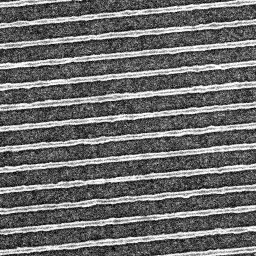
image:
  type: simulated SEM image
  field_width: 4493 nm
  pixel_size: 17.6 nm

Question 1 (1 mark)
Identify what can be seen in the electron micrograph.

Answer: parallel lines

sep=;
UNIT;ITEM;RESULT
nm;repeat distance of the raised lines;361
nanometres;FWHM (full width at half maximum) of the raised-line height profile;61.2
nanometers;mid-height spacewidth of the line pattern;297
